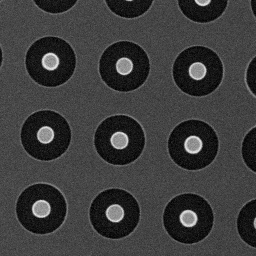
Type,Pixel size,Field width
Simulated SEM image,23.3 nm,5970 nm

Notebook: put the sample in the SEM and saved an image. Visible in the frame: an array of small figures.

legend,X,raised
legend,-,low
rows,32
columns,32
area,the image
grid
XXXX-----XXXX------XXX---X--XXX-
XXXXXX--XXXXXX----XXXXX-----XXXX
XXXXXXXXXXXXXXXXXXXXXXXX---XXXXX
XXXXXXXXXXXXXXXXXXXXXXXXXXXXXXXX
XXXXXXXXXXXXXXXXXXXXXXXXXXXXXXXX
XXXX-----XXXXX---XXXXXXXXXXXXXXX
XXX------XXXX-----XXXXX----XXXXX
XXX--XX---XX---X---XXX------XXX-
XXX---X--XXX---X---XXX--XX--XXX-
XXXX-----XXXX-----XXXX--X---XXX-
XXXXX---XXXXX-----XXXX-----XXXX-
XXXXXXXXXXXXXXX-XXXXXXX----XXXX-
XXXXXXXXXXXXXXXXXXXXXXXXXXXXXXXX
XXXXXXXXXXXXXXXXXXXXXXXXXXXXXXXX
XXXX----XXXXXX--XXXXXXXXXXXXXXXX
XXX------XXX-----XXXXX----XXXXXX
XXX--XX--XXX------XXX------XXXX-
XXX--X---XXX--XX--XXX--XX--XXX--
XXX-----XXXX------XXX--XX--XXX--
XXXX----XXXX-----XXXX------XXX--
XXXXXXXXXXXXXX--XXXXXX----XXXXX-
XXXXXXXXXXXXXXXXXXXXXXXXXXXXXXXX
XXXXXXXXXXXXXXXXXXXXXXXXXXXXXXXX
XXX----XXXXXXXXXXXXXXXXXXXXXXXXX
XX------XXXX-----XXXXX---XXXXXXX
XX--XX--XXX------XXXX-----XXXXX-
XX--XX--XXX--XX---XX---X---XXX--
XX------XXX---X--XXX---X---XXX--
XXX----XXXXX-----XXXX------XXX--
XXXXXXXXXXXXX---XXXXX-----XXXX--
XXXXXXXXXXXXXXXXXXXXXXX-XXXXXXX-
XXXXXXXXXXXXXXXXXXXXXXXXXXXXXXXX